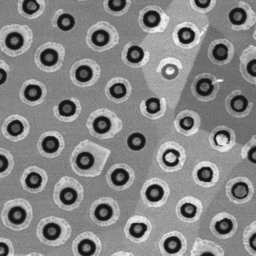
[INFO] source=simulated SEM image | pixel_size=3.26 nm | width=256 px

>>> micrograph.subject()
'a regular array of ring-shaped grooves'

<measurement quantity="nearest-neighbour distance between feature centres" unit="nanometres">125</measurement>